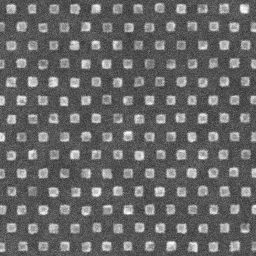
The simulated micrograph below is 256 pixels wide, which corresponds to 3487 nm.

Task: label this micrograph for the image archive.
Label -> a regular array of raised bodies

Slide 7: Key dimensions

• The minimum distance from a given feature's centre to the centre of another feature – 20.6 px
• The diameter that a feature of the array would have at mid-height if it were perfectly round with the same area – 0.126 microns